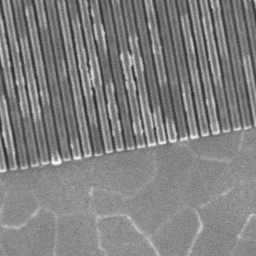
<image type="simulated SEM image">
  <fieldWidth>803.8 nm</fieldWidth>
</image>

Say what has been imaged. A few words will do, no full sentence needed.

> parallel lines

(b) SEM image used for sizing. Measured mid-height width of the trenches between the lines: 11.6 nm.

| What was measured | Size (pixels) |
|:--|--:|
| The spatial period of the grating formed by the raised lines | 10.8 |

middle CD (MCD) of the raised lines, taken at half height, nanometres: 20